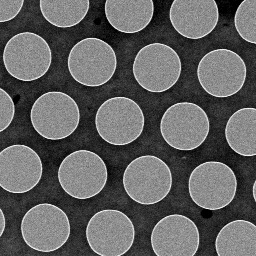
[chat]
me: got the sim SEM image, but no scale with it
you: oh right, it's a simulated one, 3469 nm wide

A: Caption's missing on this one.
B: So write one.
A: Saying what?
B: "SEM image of an array of small figures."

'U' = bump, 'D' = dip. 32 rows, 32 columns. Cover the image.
UUUDDUUUUUUDDUUUUUUDDDUUUUUDDDUU
UUDDDUUUUUUDDUUUUUUDDUUUUUUDDDUU
UDDDDDUUUUDDDDUUUUUDDUUUUUUDDUUU
DDDDDDDDDDDDDDUUUUDDDDUUUUUDDDUU
DDUUUDDDDDDDDDDDDDDDDDDUUDDDDDUU
DUUUUUDDDDUUUDDDDDDUDDDDDDDDDDDD
UUUUUUDDDUUUUUDDDUUUUUDDDDUUUDDD
UUUUUUDDDUUUUUUDDUUUUUDDDUUUUUDD
DUUUUUDDDUUUUUDDDUUUUUUDDUUUUUUD
DDUUUDDDDUUUUUDDDUUUUUDDDUUUUUUD
DDDDDDDDDDUUUDDDDUUUUUDDDUUUUUDD
UDDDDDDDDDDDDDDDDDDDDDDDDDUUUUDD
UDDDDUUUUDDDDDUUDDDDDDDDDDDDDDDD
UUDDUUUUUUDDUUUUUDDDDUUUUDDDDDDD
UUDDUUUUUUDDUUUUUUDDUUUUUUDDDUUU
UDDDUUUUUUDDUUUUUUDDUUUUUUDDUUUU
DDDDDUUUUDDDUUUUUUDDUUUUUUDDUUUU
DDDDDDDDDDDDDUUUUDDDDUUUUDDDUUUU
DUUUDDDDDDDDDDDDDDDDDDUUDDDDDUUU
UUUUUDDDDUUUDDDDDDUDDDDDDDDDDDDD
UUUUUDDDUUUUUDDDUUUUUDDDDUUUDDDD
UUUUUDDUUUUUUDDDUUUUUDDDUUUUUDDD
UUUUUDDUUUUUUDDUUUUUUDDDUUUUUDDD
UUUUDDDDUUUUUDDDUUUUUDDDUUUUUDDD
DDDDDDDDDUUUDDDDUUUUUDDDUUUUUDDD
DDDDDUDDDDDDDDDDDDUDDDDDDUUUDDDD
DDDUUUUUDDDDUUUDDDDDDDDDDDDDDDDD
UDDUUUUUDDDUUUUUDDDDUUUUDDDDDDDD
UDDUUUUUUDDUUUUUUDDUUUUUUDDDUUUU
DDDUUUUUUDDUUUUUUDDUUUUUUDDUUUUU
DDDUUUUUDDDUUUUUDDDUUUUUUDDUUUUU
DDDDDDDDDDDDUUUUDDDUUUUUDDDUUUUU